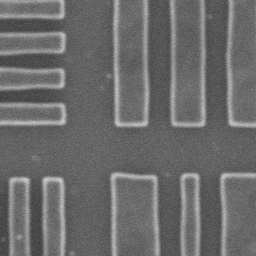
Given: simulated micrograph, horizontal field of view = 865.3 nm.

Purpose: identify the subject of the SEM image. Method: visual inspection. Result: groups of lines, slits or small figures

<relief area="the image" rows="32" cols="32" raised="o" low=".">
oooooooo.......ooo...oooo....ooo
oooooooo......oooo....ooo....ooo
..............oooo....ooo....ooo
..............oooo....ooo....ooo
oooooooo......oooo....ooo....ooo
oooooooo......oooo....ooo....ooo
oooooooo......oooo....ooo....ooo
..............oooo....ooo....ooo
..............oooo....ooo....ooo
oooooooo.......ooo....ooo....ooo
oooooooo.......ooo....ooo....ooo
...............ooo....ooo....ooo
...............ooo....ooo....ooo
oooooooo.......ooo....ooo....ooo
oooooooo.......ooo....ooo....ooo
...............ooo....ooo....ooo
................................
................................
................................
................................
................................
................................
.oo...oo......ooooo....oo...oooo
.ooo.ooo......ooooo....oo...oooo
.ooo..oo......ooooo....oo...oooo
.ooo.ooo......ooooo....oo...oooo
.ooo.ooo......ooooo....oo...oooo
.ooo.ooo......oooooo...oo...oooo
.ooo.ooo......oooooo...oo...oooo
.ooo..oo......oooooo...oo...oooo
.ooo..oo......oooooo...oo...oooo
.ooo..oo......oooooo...oo...oooo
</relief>